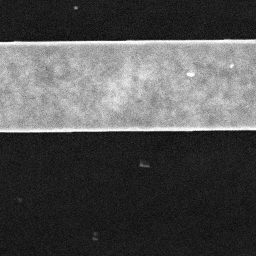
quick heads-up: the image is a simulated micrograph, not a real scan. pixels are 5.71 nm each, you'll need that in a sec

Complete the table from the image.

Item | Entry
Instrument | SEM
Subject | wiring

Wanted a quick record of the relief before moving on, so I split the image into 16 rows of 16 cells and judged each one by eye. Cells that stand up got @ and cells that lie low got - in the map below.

----------------
----------------
----------------
@@@@@@@@@@@@@@@@
@@@@@@@@@@@@@@@@
@@@@@@@@@@@@@@@@
@@@@@@@@@@@@@@@@
@@@@@@@@@@@@@@@@
----------------
----------------
----------------
----------------
----------------
----------------
----------------
----------------